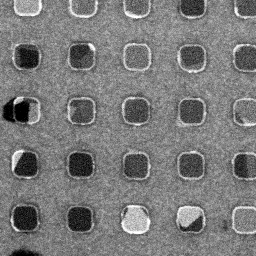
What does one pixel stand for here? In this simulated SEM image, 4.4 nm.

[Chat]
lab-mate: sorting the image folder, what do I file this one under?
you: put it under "a regular array of raised bodies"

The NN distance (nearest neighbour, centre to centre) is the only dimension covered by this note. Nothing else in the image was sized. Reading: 0.237 micrometres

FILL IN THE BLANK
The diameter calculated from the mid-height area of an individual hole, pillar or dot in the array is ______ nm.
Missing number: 123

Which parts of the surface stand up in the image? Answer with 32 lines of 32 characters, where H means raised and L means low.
LLHHHLLLLHHHLLLLHHHLLLLHHHLLLHHH
LLHHHLLLLHHHLLLLHHHLLLLHHHLLLHHH
LLLLLLLLLLLLLLLLLLLLLLLLLLLLLLLL
LLLLLLLLLLLLLLLLLLLLLLLLLLLLLLLL
LLLLLLLLLLLLLLLLLLLLLLLLLLLLLLLL
LLHHLLLLLLLLLLLLLLLLLLLLLLLLLLLL
LLHHHLLLLHHHLLLLHHHLLLHHHHLLLHHH
LLHHHLLLLHHHLLLLHHHLLLHHHHLLLHHH
LLHHLLLLLHHLLLLLHHLLLLLHHLLLLLHH
LLLLLLLLLLLLLLLLLLLLLLLLLLLLLLLL
LLLLLLLLLLLLLLLLLLLLLLLLLLLLLLLL
LLLLLLLLLLLLLLLLLLLLLLLLLLLLLLLL
LLHHHLLLLHHLLLLLHHLLLLLHHLLLLLHH
LLHHHLLLLHHHLLLHHHHLLLHHHHLLLHHH
LLHHHLLLLHHHLLLHHHHLLLHHHHLLLHHH
LLLLLLLLLLLLLLLLLLLLLLLHHLLLLLHH
LLLLLLLLLLLLLLLLLLLLLLLLLLLLLLLL
LLLLLLLLLLLLLLLLLLLLLLLLLLLLLLLL
LLLLLLLLLLLLLLLLLLLLLLLLLLLLLLLL
LLHHHLLLLHHLLLLLHHLLLLLHHLLLLHHH
LLHHHLLLHHHHLLLHHHHLLLHHHLLLLHHH
LLHHHLLLLHHHLLLHHHHLLLHHHLLLLHHH
LLLLLLLLLLLLLLLLLLLLLLLLLLLLLLLL
LLLLLLLLLLLLLLLLLLLLLLLLLLLLLLLL
LLLLLLLLLLLLLLLLLLLLLLLLLLLLLLLL
LLLLLLLLLLLLLLLLLLLLLLLLLLLLLLLL
LLHHHLLLHHHHLLLHHHLLLLHHHLLLLHHH
LLHHHLLLHHHHLLLHHHLLLLHHHLLLLHHH
LLHHLLLLLHHLLLLLHHLLLLHHHLLLLHHH
LLLLLLLLLLLLLLLLLLLLLLLLLLLLLLLL
LLLLLLLLLLLLLLLLLLLLLLLLLLLLLLLL
LLLLLLLLLLLLLLLLLLLLLLLLLLLLLLLL